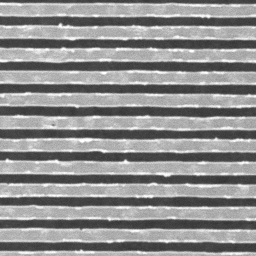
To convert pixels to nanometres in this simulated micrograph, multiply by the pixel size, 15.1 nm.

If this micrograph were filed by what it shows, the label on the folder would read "parallel lines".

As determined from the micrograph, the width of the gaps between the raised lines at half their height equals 0.163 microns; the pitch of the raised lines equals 0.341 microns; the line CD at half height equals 0.185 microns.